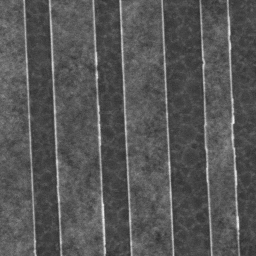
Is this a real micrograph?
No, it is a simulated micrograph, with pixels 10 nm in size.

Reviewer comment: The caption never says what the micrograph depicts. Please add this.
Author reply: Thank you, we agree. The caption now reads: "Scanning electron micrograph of one or a few lines or trenches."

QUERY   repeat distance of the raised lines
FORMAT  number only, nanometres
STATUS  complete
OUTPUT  712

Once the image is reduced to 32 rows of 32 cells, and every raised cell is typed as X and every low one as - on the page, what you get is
XXX---XXXXXX---XXXXX-----XXX----
XXX---XXXXXX---XXXXX-----XXXX---
XXX---XXXXXX---XXXXX-----XXXX---
XXX---XXXXXX---XXXXX-----XXXX---
XXX---XXXXXX---XXXXX-----XXXX---
XXX---XXXXXX---XXXXX-----XXXX---
XXX---XXXXXX---XXXXXX----XXXX---
XXX----XXXXX---XXXXXX----XXXX---
XXX----XXXXX---XXXXXX----XXXX---
XXX----XXXXX---XXXXXX----XXXX---
XXX----XXXXX---XXXXXX----XXXX---
XXXX---XXXXX---XXXXXX----XXXX---
XXXX---XXXXX----XXXXX-----XXX---
XXXX---XXXXX----XXXXX-----XXX---
XXXX---XXXXX----XXXXX-----XXX---
XXXX---XXXXX----XXXXX-----XXX---
XXXX---XXXXX----XXXXX-----XXX---
XXXX---XXXXX----XXXXX-----XXX---
XXXX---XXXXX----XXXXX-----XXX---
XXXX---XXXXXX---XXXXX-----XXX---
XXXX---XXXXXX---XXXXX-----XXX---
XXXX---XXXXXX---XXXXX-----XXX---
XXXX---XXXXXX---XXXXX-----XXX---
XXXX---XXXXXX---XXXXX-----XXXX--
XXXX---XXXXXX---XXXXX-----XXXX--
XXXX---XXXXXX---XXXXX-----XXXX--
XXXX---XXXXXX---XXXXX-----XXXX--
XXXX---XXXXXX---XXXXX-----XXXX--
XXXX---XXXXXX---XXXXXX----XXXX--
XXXX----XXXXX---XXXXXX----XXXX--
XXXX----XXXXX---XXXXXX----XXXX--
XXXX----XXXXX---XXXXXX----XXXX--